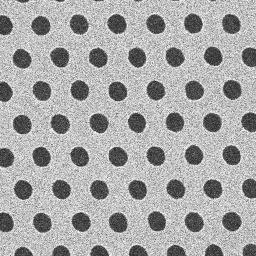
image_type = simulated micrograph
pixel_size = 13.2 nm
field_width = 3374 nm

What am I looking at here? a regular array of holes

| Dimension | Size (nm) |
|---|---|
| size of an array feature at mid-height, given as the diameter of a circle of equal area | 259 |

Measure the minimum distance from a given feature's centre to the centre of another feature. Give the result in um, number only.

0.493